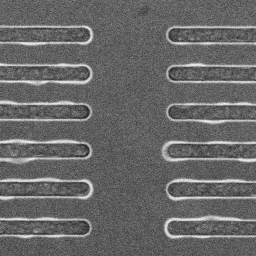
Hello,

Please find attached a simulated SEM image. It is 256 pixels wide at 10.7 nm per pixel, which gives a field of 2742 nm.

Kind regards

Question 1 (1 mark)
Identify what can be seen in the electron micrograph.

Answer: groups of lines, slits or small figures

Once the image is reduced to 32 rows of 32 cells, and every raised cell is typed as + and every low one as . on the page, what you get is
++++++++++++++++++++++++++++++++
++++++++++++++++++++++++++++++++
++++++++++++++++++++++++++++++++
...........+++++++++++..........
...........++++++++++...........
++++++++++++++++++++++++++++++++
++++++++++++++++++++++++++++++++
++++++++++++++++++++++++++++++++
...........++++++++++...........
...........++++++++++...........
++++++++++++++++++++++++++++++++
++++++++++++++++++++++++++++++++
++++++++++++++++++++++++++++++++
...........++++++++++...........
...........++++++++++...........
++++++++++++++++++++++++++++++++
++++++++++++++++++++++++++++++++
++++++++++++++++++++++++++++++++
...........++++++++++...........
...........++++++++++...........
++++++++++++++++++++++++++++++++
++++++++++++++++++++++++++++++++
+++++.++++++++++++++++++++++++++
...........++++++++++...........
...........++++++++++...........
++++++++++++++++++++++++++++++++
++++++++++++++++++++++++++++++++
..........++++++++++++........++
...........++++++++++...........
++++++.++++++++++++++...........
++++++++++++++++++++++++++++++++
++++++++++++++++++++++++++++++++